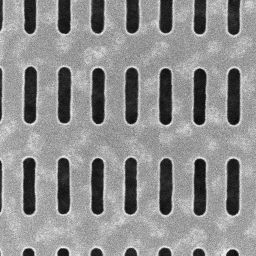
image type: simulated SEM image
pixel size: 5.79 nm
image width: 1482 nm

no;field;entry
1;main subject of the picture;a regular array of holes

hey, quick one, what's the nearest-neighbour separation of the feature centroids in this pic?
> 196 nanometres